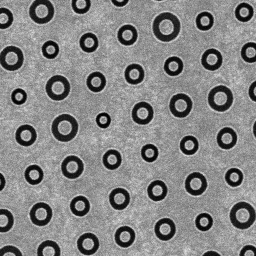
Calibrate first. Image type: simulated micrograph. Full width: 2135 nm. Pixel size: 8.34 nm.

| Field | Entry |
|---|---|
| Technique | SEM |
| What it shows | a regular array of ring-shaped grooves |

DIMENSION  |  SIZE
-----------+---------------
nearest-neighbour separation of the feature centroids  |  324 nanometers